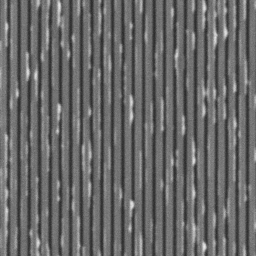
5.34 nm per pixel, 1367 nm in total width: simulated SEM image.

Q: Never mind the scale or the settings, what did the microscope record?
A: parallel lines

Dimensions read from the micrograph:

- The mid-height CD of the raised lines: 6.37 pixels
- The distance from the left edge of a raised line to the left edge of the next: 55.5 nanometres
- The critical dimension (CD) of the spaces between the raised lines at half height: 20 nanometres